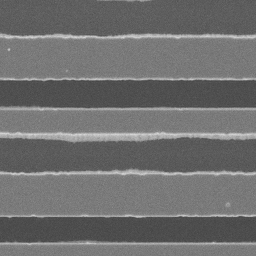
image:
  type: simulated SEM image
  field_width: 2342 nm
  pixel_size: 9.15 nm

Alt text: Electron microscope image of lines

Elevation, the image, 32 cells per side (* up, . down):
................................
................................
................................
................................
................................
********************************
********************************
********************************
********************************
********************************
................................
................................
................................
................................
********************************
********************************
********************************
................................
................................
................................
................................
................................
********************************
********************************
********************************
********************************
********************************
................................
................................
................................
********************************
********************************